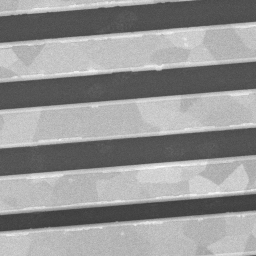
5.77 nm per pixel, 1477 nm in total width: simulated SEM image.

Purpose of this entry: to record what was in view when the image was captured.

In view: one or a few lines or trenches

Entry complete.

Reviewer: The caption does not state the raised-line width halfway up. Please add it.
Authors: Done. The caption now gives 35.8 px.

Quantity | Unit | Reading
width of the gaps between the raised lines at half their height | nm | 175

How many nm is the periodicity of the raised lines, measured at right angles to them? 380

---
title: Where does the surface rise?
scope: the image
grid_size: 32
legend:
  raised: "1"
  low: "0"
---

11111111111111110000000000000000
11110000000000000000000000000000
00000000000000000000000000000000
00000000000000000000000001111111
00000000000001111111111111111111
01111111111111111111111111111111
11111111111111111111111111111111
11111111111111111111111111111111
11111111111111111111000000000000
11111110000000000000000000000000
00000000000000000000000000000000
00000000000000000000000000000011
00000000000000000011111111111111
00000011111111111111111111111111
11111111111111111111111111111111
11111111111111111111111111111111
11111111111111111111111000000000
11111111111000000000000000000000
00000000000000000000000000000000
00000000000000000000000000000000
00000000000000000000011111111111
00000000011111111111111111111111
11111111111111111111111111111111
11111111111111111111111111111111
11111111111111111111111111000000
11111111111111000000000000000000
11000000000000000000000000000000
00000000000000000000111111111111
00000000111111111111111111111111
11111111111111111111111111111111
11111111111111111111111111111111
11111111111111111111111111111111